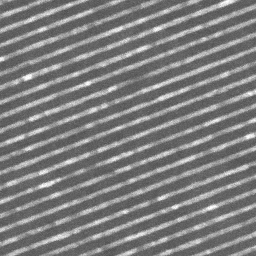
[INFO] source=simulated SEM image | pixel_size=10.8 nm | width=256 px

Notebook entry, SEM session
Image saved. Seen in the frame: parallel lines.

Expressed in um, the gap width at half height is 0.11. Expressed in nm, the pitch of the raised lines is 144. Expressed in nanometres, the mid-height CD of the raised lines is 36.8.